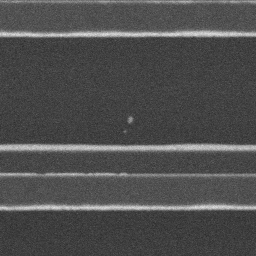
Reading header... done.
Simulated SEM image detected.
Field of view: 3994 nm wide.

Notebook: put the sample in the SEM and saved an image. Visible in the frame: lines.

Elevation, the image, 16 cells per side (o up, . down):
oooooooooooooooo
oooooooooooooooo
................
................
................
................
................
................
................
................
................
oooooooooooooooo
oooooooooooooooo
................
................
................